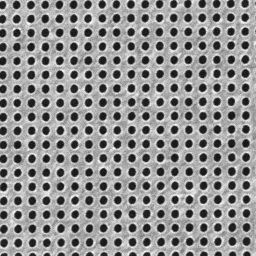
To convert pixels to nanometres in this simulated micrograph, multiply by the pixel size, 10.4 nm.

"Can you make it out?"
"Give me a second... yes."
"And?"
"a regular array of holes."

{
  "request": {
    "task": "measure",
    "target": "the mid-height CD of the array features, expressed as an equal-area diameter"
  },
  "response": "88.6 nanometers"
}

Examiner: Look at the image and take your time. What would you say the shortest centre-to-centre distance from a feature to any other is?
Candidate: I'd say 142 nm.